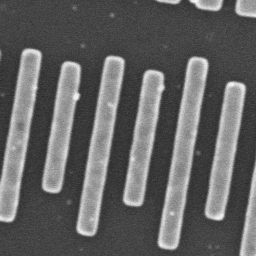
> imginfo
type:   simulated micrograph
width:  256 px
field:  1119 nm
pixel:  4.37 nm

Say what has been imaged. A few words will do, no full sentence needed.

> groups of lines, slits or small figures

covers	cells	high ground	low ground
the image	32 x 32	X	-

------------------------XXXX--XX
------------------------------XX
--------------------------------
--------------------------------
--------------------------------
--------------------------------
---XX---------------------------
---XX--------XX---------X-------
---XX---XX---XX---------XX------
--XXX---XX---XX---XX---XXX------
--XXX--XXX---XX---XX---XX----X--
--XX---XXX--XXX---XX---XX---XX--
--XX---XXX--XXX---XX---XX---XX--
--XX---XX---XX---XXX---XX---XX--
--XX---XX---XX---XXX---XX---XX--
-XXX---XX---XX---XX---XXX---XX--
-XX---XXX---XX---XX---XX---XXX--
-XX---XXX--XXX---XX---XX---XX---
-XX---XX---XXX---XX---XX---XX---
-XX---XX---XXX--XXX---XX---XX---
-XX---XX---XX---XXX--XXX---XX---
XXX---XX---XX---XX---XXX---XX---
XX---XXX---XX---XX---XX---XXX---
XX----X----XX---XX---XX---XXX---
XX--------XXX---XX---XX---XX---X
XX--------XX----X----XX---XX---X
XX--------XX--------XXX---XX---X
X---------XX--------XXX--------X
----------XX--------XXX--------X
--------------------XX--------XX
--------------------XX--------XX
------------------------------XX